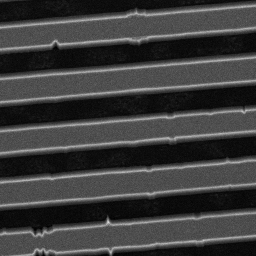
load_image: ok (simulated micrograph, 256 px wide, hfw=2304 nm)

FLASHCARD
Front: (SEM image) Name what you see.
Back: parallel lines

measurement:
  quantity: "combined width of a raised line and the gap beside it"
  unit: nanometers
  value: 465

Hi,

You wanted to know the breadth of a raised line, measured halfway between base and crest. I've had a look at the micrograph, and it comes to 254 nm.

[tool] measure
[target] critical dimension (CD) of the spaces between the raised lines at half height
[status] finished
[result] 211 nm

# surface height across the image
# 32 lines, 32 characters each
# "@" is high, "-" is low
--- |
------------------------------@@
----------------@@--@@@@@@@@@@@@
-------@@@@@@@@@@@@@@@@@@@@@@@@@
@@@@@@@@@@@@@@@@@@@@@@@@@@@@@@@@
@@@@@@@@@@@@@@@@@@@@@@@@--------
@@@@@@@@@@@@--------------------
@-------------------------------
------------------------@@@@@@@@
--------------@@@@@@@@@@@@@@@@@@
@@@@@@@@@@@@@@@@@@@@@@@@@@@@@@@@
@@@@@@@@@@@@@@@@@@@@@@@@@@@@@@@-
@@@@@@@@@@@@@@@@@@--------------
@@@@@@@-------------------------
-------------------------------@
-------------------@@@@@@@@@@@@@
-------@@@@@@@@@@@@@@@@@@@@@@@@@
@@@@@@@@@@@@@@@@@@@@@@@@@@@@@@@@
@@@@@@@@@@@@@@@@@@@@@@----------
@@@@@@@@@@----------------------
--------------------------------
-----------------------@@@@@@@@@
-----------@@@@@@@@@@@@@@@@@@@@@
@@@@@@@@@@@@@@@@@@@@@@@@@@@@@@@@
@@@@@@@@@@@@@@@@@@@@@@@@@@@@@---
@@@@@@@@@@@@@@@@@@@@------------
@@@@@@@-------------------------
-----------------------------@@@
------------------@@@@@@@@@@@@@@
-------@@@@@@@@@@@@@@@@@@@@@@@@@
@@@@@@@@@@@@@@@@@@@@@@@@@@@@@@@@
@@@@@@@@@@@@@@@@@@@@@@@@@-------
@@@@@@@@@@@@@@------------------